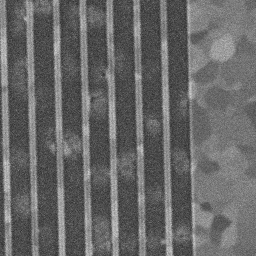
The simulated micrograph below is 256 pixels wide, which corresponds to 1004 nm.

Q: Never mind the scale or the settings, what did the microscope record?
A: parallel lines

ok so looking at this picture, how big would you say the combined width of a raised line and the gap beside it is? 105 nanometers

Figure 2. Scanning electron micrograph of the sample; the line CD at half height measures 17.1 nanometres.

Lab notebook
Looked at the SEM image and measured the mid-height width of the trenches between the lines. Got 88.1 nanometres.